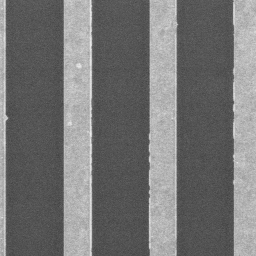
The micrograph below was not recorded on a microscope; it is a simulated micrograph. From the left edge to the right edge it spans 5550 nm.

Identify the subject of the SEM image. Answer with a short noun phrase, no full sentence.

lines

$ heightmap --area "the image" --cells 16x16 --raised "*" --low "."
....**...**....*
....**...**....*
....**...**....*
....**...**....*
....**...**....*
....**...**....*
....**...**....*
....**...**....*
....**...**....*
....**...**....*
....**...**....*
....**...**....*
....**...**....*
....**...**....*
....**...**....*
....**...**....*